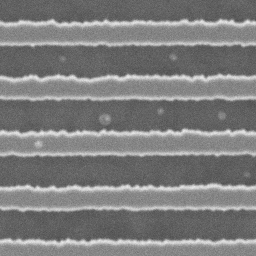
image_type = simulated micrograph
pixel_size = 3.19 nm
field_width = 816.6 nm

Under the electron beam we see lines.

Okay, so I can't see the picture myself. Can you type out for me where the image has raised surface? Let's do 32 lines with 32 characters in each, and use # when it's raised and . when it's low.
................................
................................
................................
################################
################################
################################
................................
................................
................................
...##.##.....##.####..#.#..##..#
################################
################################
................................
................................
................................
................................
##...###.######.##.#.#####.#####
################################
################################
................................
................................
................................
................................
#####.#.########################
################################
################################
................................
................................
................................
................................
################################
################################